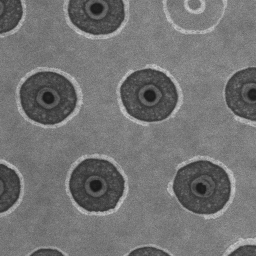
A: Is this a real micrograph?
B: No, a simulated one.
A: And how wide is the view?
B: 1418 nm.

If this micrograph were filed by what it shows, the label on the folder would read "ring-shaped grooves with a dot in the middle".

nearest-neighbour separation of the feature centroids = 556 nm